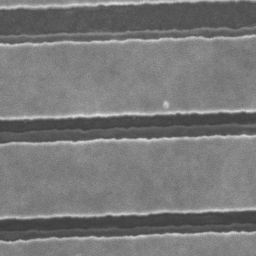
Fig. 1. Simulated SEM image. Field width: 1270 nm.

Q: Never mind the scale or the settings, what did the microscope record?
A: lines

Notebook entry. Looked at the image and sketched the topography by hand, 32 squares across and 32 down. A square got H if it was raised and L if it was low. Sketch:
HHHHHHHHHHHHHHLLLLLLLLLLLLLLLLLL
LLLLLLLLLLLLLLLLLLLLLLLLLLLLLLLL
LLLLLLLLLLLLLLLLLLLLLLLLLLLLLLLL
LLLLLLLLLLLLLLLLLLLLLLLLLLLLLLLL
LLLLLLLLLLLLLLLLLLLLLLLLLLLLLLHH
LLLHHHHHHHHHHHHHHHHHHHHHHHHHHHHH
HHHHHHHHHHHHHHHHHHHHHHHHHHHHHHHH
HHHHHHHHHHHHHHHHHHHHHHHHHHHHHHHH
HHHHHHHHHHHHHHHHHHHHHHHHHHHHHHHH
HHHHHHHHHHHHHHHHHHHHHHHHHHHHHHHH
HHHHHHHHHHHHHHHHHHHHHHHHHHHHHHHH
HHHHHHHHHHHHHHHHHHHHHHHHHHHHHHHH
HHHHHHHHHHHHHHHHHHHHHHHHHHHHHHHH
HHHHHHHHHHHHHHHHHHHHHHHHHHHHHHHH
HHHHHHHHHHHHHHLLLLLLLLLLLLLLLLLL
LLLLLLLLLLLLLLLLLLLLLLLLLLLLLLLL
LLLLLLLLLLLLLLLLLLLLLLLLLLLLLLLL
LLLLLLLLLLLHHHHHHHHHHHHHHHHHHHHH
HHHHHHHHHHHHHHHHHHHHHHHHHHHHHHHH
HHHHHHHHHHHHHHHHHHHHHHHHHHHHHHHH
HHHHHHHHHHHHHHHHHHHHHHHHHHHHHHHH
HHHHHHHHHHHHHHHHHHHHHHHHHHHHHHHH
HHHHHHHHHHHHHHHHHHHHHHHHHHHHHHHH
HHHHHHHHHHHHHHHHHHHHHHHHHHHHHHHH
HHHHHHHHHHHHHHHHHHHHHHHHHHHHHHHH
HHHHHHHHHHHHHHHHHHHHHHHHHHHHHHHH
HHHHHHHHHHHHHHHHHHHHHHHHHHLLLLLL
LLLLLLLLLLLLLLLLLLLLLLLLLLLLLLLL
LLLLLLLLLLLLLLLLLLLLLLLLLLLLLLLL
LLLLLLLLLLLLLLLLLHHHHHHHHHHHHHHH
HHHHHHHHHHHHHHHHHHHHHHHHHHHHHHHH
HHHHHHHHHHHHHHHHHHHHHHHHHHHHHHHH